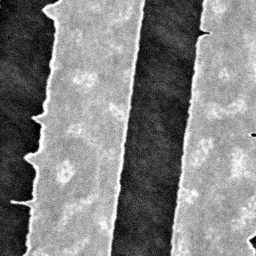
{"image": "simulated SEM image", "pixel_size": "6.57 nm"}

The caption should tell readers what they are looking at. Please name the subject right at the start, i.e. one or a few lines or trenches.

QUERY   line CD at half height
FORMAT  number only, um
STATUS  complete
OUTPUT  0.544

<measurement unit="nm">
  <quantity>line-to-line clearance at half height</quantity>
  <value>396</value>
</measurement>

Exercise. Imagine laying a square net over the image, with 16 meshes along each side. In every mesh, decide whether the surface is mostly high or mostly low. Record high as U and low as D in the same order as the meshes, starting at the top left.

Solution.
DDDUUUUUUDDDDUUU
DDDUUUUUUDDDDUUU
DDDUUUUUUDDDUUUU
DDDUUUUUDDDDUUUU
DDDUUUUUDDDDUUUU
DDDUUUUUDDDDUUUU
DDDUUUUUDDDDUUUU
DDUUUUUUDDDDUUUU
DDDUUUUUDDDDUUUU
DDUUUUUUDDDUUUUU
DDUUUUUUDDDUUUUU
DDUUUUUDDDDUUUUU
DDUUUUUDDDDUUUUU
DDUUUUUDDDDUUUUU
DDUUUUUDDDDUUUUU
DDUUUUUDDDDUUUUU